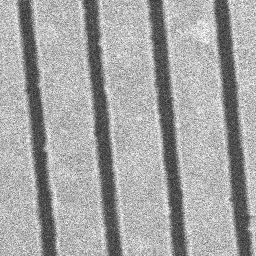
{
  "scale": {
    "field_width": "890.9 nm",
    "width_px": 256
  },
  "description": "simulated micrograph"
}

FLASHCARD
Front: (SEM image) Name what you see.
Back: one or a few lines or trenches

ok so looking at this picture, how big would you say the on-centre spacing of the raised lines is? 227 nm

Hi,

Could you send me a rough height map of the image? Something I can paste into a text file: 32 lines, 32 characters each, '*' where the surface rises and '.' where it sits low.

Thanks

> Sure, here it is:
**..******..******..*******..***
**..******...*****...******..***
**..******...******..******..***
**..*******..******..******..***
**..*******..******..******..***
***..******..******..******..***
***..******..******..******..***
***..******..******..******..***
***..******..******..******..***
***..******..******..******...**
***..******..******..*******..**
***..******..******...******..**
***..******...******..******..**
***..******...******..******..**
***...******..******..******..**
****..******..******..******..**
****..******..******..******..**
****..******..******..******..**
****..******..******..******..**
****..******..******..******...*
****..******..******..*******..*
****..******..*******..******..*
****..******...******..******..*
*****.******...******..******..*
****...******..******..******..*
*****..******..******..******..*
*****..******..******..******..*
*****..******..******..******..*
*****..******..******..******..*
*****..******..******..******..*
*****..******..******..*******..
*****..******..******...******..